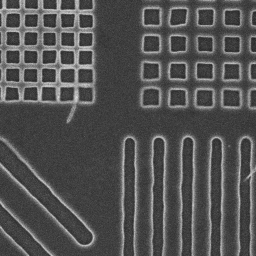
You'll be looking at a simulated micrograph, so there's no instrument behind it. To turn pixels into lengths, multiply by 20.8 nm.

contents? groups of lines, slits or small figures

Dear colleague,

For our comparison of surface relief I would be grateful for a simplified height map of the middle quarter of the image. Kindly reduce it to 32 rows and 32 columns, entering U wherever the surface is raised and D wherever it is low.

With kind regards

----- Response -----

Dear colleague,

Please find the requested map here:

UUUUUUUUUUUUUUUUUUUUDDDDUUDDDDDU
DDDUDDDUUUUUUUUUUUUDDDDDUUDDDDDU
DDDDDDDUUUUUUUUUUUUDDDDDUUDDDDDU
DDDDDDDUUUUUUUUUUUUUDDDDUUUDDDUU
DDDDDDDUUUUUUUUUUUUUUUUUUUUUUUUU
DDUUDDDUUUUUUUUUUUUUUUUUUUUUUUUU
DDDDDDDUUUUUUUUUUUUUDDDDUUUDDDUU
DDDDDDDUUUUUUUUUUUUDDDDDUUDDDDDU
DDDDDDDUUUUUUUUUUUUDDDDDUUDDDDDU
DDUUDDDUUUUUUUUUUUUDDDDDUUDDDDDU
UUUUUUUUUUUUUUUUUUUUDDDUUUDDDDUU
UUUUUUUUUUUUUUUUUUUUUUUUUUUUUUUU
UUUUUUUUUUUUUUUUUUUUUUUUUUUUUUUU
UUUUUUUUUUUUUUUUUUUUUUUUUUUUUUUU
UUUUUUUUUUUUUUUUUUUUUUUUUUUUUUUU
UUUUUUUUUUUUUUUUUUUUUUUUUUUUUUUU
UUUUUUUUUUUUUUUUUUUUUUUUUUUUUUUU
UUUUUUUUUUUUUUUUUUUUUUUUUUUUUUUU
UUUUUUUUUUUUUUUUDUUUUUUDUUUUUUDD
UUUUUUUUUUUUUUUDDDUUUUDDDUUUUUDD
UUUUUUUUUUUUUUUDDDUUUUDDDUUUUUDD
UUUUUUUUUUUUUUUDDDUUUUDDDUUUUDDD
UUUUUUUUUUUUUUUDDDUUUUDDDUUUUDDD
UUUUUUUUUUUUUUUDDDUUUUDDDUUUUDDD
UUUUUUUUUUUUUUUDDDUUUUDDDUUUUDDD
UUUUUUUUUUUUUUUDDDUUUUDDDUUUUDDD
UUUUUUUUUUUUUUUDDDUUUUDDDUUUUDDD
UUUUUUUUUUUUUUUDDDUUUUDDDUUUUDDD
UUUUUUUUUUUUUUUDDDUUUUDDDUUUUDDD
UUUUUUUUUUUUUUUDDDUUUUDDDUUUUDDD
UUUUUUUUUUUUUUUDDDUUUUDDDUUUUDDD
UUUUUUUUUUUUUUUDDDUUUUDDDUUUUDDD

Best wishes